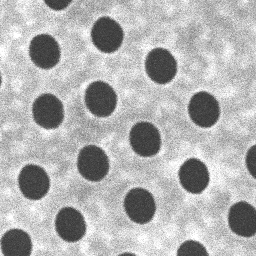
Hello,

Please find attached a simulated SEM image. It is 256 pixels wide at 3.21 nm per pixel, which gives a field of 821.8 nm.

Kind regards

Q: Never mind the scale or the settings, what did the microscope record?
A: a regular array of holes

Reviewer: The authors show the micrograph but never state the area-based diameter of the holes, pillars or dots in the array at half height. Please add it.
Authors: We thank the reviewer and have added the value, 111 nanometers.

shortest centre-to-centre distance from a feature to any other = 0.189 micrometres